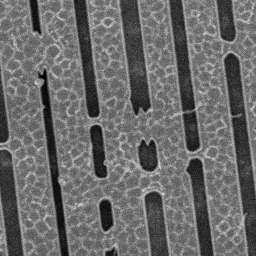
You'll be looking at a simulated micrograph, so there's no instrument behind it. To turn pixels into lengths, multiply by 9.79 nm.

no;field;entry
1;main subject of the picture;parallel lines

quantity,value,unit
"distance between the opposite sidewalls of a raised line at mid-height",332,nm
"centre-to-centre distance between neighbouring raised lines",463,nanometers